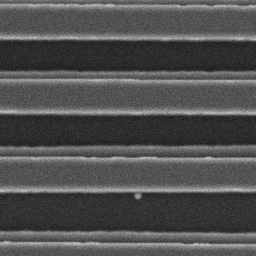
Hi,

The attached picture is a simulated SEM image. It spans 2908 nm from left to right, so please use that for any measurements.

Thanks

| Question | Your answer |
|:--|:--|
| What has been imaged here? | lines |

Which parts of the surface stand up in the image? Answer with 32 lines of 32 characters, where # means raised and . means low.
################################
################################
################################
################################
################################
................................
................................
................................
................................
################################
################################
################################
################################
################################
................................
................................
................................
................................
.................##....###..####
################################
################################
################################
################################
################################
................................
................................
................................
................................
................................
################################
################################
################################